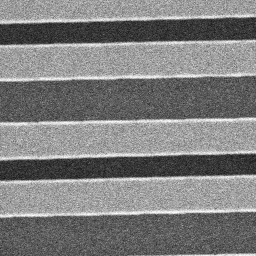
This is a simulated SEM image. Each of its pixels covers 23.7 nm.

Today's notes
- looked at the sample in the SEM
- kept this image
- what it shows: lines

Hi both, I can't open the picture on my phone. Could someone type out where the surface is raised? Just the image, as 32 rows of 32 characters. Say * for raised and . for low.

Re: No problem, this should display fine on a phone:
********************************
********************************
***************.................
................................
................................
........************************
********************************
********************************
********************************
**************************......
................................
................................
................................
................................
................................
********************************
********************************
********************************
********************************
**************..................
................................
................................
..........**********************
********************************
********************************
********************************
****************************....
................................
................................
................................
................................
................................